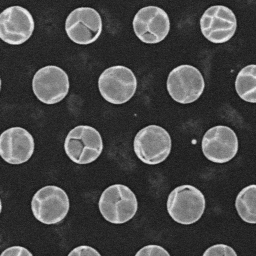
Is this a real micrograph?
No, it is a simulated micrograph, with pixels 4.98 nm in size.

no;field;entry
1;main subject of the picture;a regular array of raised bodies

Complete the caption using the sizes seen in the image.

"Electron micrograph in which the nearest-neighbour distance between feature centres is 67.4 pixels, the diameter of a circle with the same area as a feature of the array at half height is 36.9 pixels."